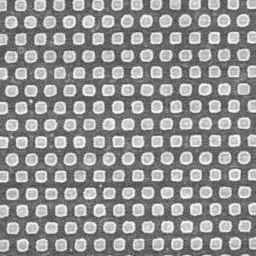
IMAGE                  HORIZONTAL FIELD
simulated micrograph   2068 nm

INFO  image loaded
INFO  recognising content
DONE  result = a regular array of raised bodies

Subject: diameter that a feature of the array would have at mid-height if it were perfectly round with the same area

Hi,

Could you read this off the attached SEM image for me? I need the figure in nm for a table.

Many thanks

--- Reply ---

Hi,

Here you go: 90.7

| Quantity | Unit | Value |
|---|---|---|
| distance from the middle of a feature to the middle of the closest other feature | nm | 154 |